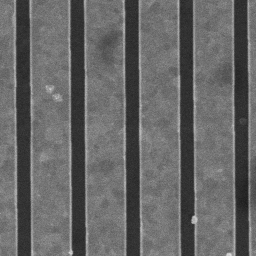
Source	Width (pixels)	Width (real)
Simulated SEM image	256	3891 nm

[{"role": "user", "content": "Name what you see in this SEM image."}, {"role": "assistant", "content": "wiring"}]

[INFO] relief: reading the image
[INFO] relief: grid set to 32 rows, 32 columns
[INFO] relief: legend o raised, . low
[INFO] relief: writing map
oo..ooooo..oooo..ooooo..ooooo..o
oo..ooooo..ooooo.ooooo..ooooo..o
oo..ooooo..ooooo.ooooo..ooooo..o
oo..ooooo..ooooo.ooooo..ooooo..o
oo..ooooo..ooooo.ooooo..ooooo..o
oo..ooooo..ooooo.ooooo..ooooo..o
oo..ooooo..ooooo.ooooo..ooooo..o
oo..ooooo..ooooo.ooooo..ooooo..o
oo..ooooo..ooooo.ooooo..ooooo..o
oo..ooooo..ooooo..oooo..ooooo..o
oo..ooooo..ooooo..oooo..ooooo..o
oo..ooooo..ooooo..oooo..ooooo..o
oo..ooooo..ooooo..oooo..ooooo..o
oo..ooooo..ooooo..oooo..ooooo..o
oo..ooooo..ooooo..oooo..ooooo..o
oo..ooooo..ooooo..oooo..ooooo..o
oo..ooooo..ooooo..oooo..ooooo..o
oo..ooooo..ooooo..oooo..ooooo..o
oo..ooooo..ooooo..oooo..ooooo..o
oo..ooooo..ooooo..oooo..ooooo..o
oo..ooooo..ooooo..oooo..ooooo..o
oo..ooooo..ooooo..oooo..ooooo..o
oo..ooooo..ooooo..oooo..ooooo..o
oo..ooooo..ooooo..oooo..ooooo..o
oo..ooooo..ooooo..oooo..ooooo..o
oo..ooooo..ooooo..oooo..ooooo..o
oo..ooooo..ooooo..oooo..ooooo..o
oo..ooooo..ooooo..oooo..ooooo..o
oo..ooooo..ooooo..oooo..ooooo..o
oo..ooooo..ooooo..oooo..ooooo..o
oo..ooooo..ooooo..oooo..ooooo..o
oo..ooooo..ooooo..oooo..ooooo..o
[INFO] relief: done